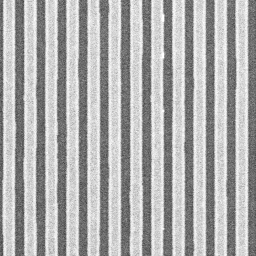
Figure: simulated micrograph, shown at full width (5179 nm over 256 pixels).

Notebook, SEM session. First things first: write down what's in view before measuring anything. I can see parallel lines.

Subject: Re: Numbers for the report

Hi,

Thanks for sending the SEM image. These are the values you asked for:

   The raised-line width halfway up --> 0.192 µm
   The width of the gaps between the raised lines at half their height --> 250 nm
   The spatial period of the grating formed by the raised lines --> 0.428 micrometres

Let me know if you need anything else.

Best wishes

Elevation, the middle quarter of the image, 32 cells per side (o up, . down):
.oo...oo....oo...oo...oo....oo..
.oo...oo...ooo...oo...oo....oo..
.oo...oo...ooo...oo...oo....oo..
.oo...oo...ooo...oo...oo....oo..
.oo...oo...ooo...oo...oo....oo..
.oo...oo....oo...oo...oo....oo..
.oo...oo....oo...oo...oo....oo..
.oo...oo....oo...oo...oo....oo..
.oo...oo....oo...oo...oo....oo..
.oo...oo....oo...oo...oo....oo..
.oo...oo....oo...oo...oo....oo..
.oo...oo....oo...oo...oo....oo..
.oo...ooo...oo...oo...oo...ooo..
.oo...ooo...oo...oo...oo...ooo..
.oo...ooo...oo...oo...oo...ooo..
.oo...ooo...oo...oo...oo...ooo..
.oo...oo....oo...oo...oo...ooo..
.oo...oo....oo...oo...oo....oo..
.oo...oo....oo...oo...oo....oo..
.oo...oo....oo...oo...oo...ooo..
.oo...oo....oo...oo...oo...ooo..
.oo...oo....oo...oo...oo...ooo..
.oo...oo....oo...oo...oo...ooo..
.oo...ooo...oo...oo...oo...ooo..
.oo...ooo...oo...oo...oo...ooo..
.oo...ooo...oo...oo...oo...ooo..
.oo...ooo...oo...oo...oo...ooo..
.oo...ooo...oo...oo...oo...ooo..
.oo...ooo...oo...oo...oo...ooo..
.oo...ooo...oo...oo...oo...ooo..
.oo...oo....oo...oo...oo...ooo..
.oo...oo....oo...oo...oo...ooo..